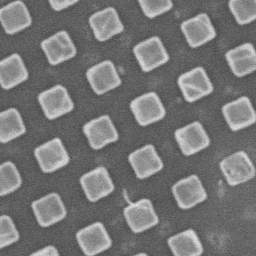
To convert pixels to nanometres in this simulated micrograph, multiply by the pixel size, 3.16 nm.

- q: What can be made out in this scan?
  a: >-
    a regular array of raised bodies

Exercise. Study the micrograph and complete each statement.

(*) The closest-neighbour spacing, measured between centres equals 167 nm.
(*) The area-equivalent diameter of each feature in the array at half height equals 93.4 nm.